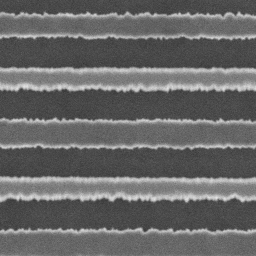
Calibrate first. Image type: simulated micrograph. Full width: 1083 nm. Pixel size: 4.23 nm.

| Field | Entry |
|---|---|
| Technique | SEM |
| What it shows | lines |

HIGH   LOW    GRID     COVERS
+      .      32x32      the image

................................
................................
++++++++++++++++++++++++++++++++
++++++++++++++++++++++++++++++++
++++++++++++++++++++++++++++++++
................................
................................
................................
........+.......................
++++++++++++++++++++++++++++++++
++++++++++++++++++++++++++++++++
................................
................................
................................
................................
++++++++++++++++++++++++++++++++
++++++++++++++++++++++++++++++++
++++++++++++++++++++++++++++++++
+.....+.+.++.++++..+.+++........
................................
................................
................................
++++++++++++++++++++++++++++++++
++++++++++++++++++++++++++++++++
++++++++++++++++++++++++++++++++
................................
................................
................................
................................
++++++++++++++++++++++++++++++++
++++++++++++++++++++++++++++++++
++++++++++++++++++++++++++++++++